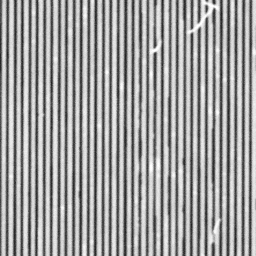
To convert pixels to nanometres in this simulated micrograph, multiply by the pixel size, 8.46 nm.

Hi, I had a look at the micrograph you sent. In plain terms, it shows parallel lines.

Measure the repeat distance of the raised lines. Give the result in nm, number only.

62.3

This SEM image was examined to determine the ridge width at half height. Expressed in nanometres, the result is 37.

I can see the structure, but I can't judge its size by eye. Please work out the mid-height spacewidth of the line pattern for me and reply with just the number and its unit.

2.62 px